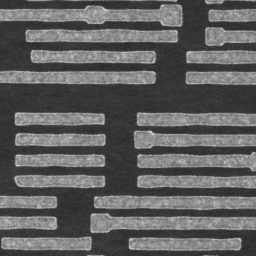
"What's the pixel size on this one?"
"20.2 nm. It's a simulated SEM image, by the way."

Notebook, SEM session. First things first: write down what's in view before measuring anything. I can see wiring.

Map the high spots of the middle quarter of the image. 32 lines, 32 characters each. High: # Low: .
................................
................................
#######################........#
#######################........#
#######################........#
................................
................................
................................
................................
................................
................................
................................
#######............###.#######..
##########.........#############
##########.........#############
................................
................................
..................#####.........
##########........##############
##########........##############
..................####.....####.
................................
................................
##########.........#############
##########.........#############
...................#############
................................
................................
##########.........#############
##########.........#############
##########.........######.######
................................